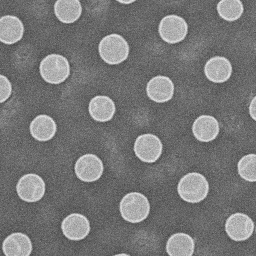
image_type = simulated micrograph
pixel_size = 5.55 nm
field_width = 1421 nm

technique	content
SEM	a regular array of raised bodies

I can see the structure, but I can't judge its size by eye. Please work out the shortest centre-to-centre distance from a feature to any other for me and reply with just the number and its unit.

0.334 micrometres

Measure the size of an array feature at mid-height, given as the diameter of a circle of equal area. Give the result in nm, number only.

152